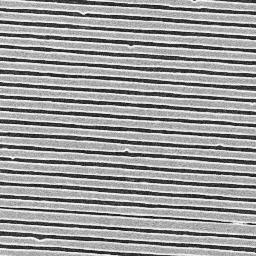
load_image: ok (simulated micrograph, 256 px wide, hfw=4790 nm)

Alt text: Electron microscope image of parallel lines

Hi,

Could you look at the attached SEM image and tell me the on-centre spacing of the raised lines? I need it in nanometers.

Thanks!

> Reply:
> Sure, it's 232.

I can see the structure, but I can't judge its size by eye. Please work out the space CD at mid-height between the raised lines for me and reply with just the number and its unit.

0.0887 microns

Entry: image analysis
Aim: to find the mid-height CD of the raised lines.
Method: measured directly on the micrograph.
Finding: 142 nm